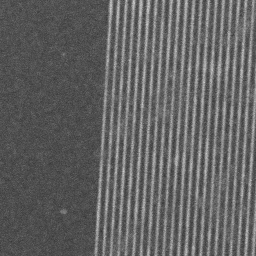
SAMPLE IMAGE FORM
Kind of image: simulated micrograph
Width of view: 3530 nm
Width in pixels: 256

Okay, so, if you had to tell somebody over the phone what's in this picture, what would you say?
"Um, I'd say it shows parallel lines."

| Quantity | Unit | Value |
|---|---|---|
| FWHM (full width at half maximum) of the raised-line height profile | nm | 27.5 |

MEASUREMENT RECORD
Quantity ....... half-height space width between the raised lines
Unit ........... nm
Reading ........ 75.7